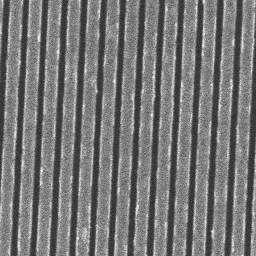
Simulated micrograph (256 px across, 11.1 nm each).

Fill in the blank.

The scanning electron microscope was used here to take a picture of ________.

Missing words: parallel lines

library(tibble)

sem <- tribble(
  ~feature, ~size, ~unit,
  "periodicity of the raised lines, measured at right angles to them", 0.216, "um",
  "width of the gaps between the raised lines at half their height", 6.99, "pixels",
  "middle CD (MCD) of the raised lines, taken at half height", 145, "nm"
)